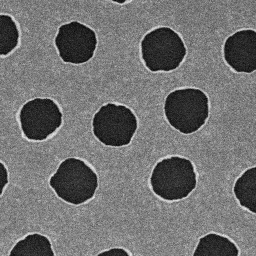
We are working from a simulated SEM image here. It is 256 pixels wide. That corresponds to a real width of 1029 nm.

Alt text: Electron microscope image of holes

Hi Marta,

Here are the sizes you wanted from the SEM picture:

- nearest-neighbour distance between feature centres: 69 px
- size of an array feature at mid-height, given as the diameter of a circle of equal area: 181 nanometers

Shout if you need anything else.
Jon